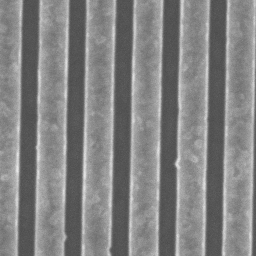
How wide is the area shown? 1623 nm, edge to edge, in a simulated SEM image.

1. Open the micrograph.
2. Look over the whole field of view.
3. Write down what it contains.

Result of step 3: parallel lines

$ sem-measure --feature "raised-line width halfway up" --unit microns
0.182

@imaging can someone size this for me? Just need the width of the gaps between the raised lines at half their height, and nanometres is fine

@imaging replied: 113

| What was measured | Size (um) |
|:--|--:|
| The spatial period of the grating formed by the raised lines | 0.297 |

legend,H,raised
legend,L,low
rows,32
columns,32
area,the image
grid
HHHLLHHHLLLHHHLLLHHHLLLHHHLLHHHH
HHHLLHHHLLLHHHLLLHHHLLLHHHLLHHHH
HHHLLHHHLLLHHHLLLHHHLLLHHHLLHHHH
HHHLLHHHLLLHHHLLLHHHLLLHHHLLHHHH
HHHLLHHHLLLHHHLLLHHHLLLHHHLLHHHH
HHHLLHHHLLLHHHLLLHHHLLLHHHLLHHHH
HHHLLHHHLLLHHHLLLHHHLLHHHHLLHHHH
HHHLLHHHLLLHHHLLLHHHLLHHHHLLHHHH
HHHLLHHHLLLHHHLLLHHHLLHHHHLLHHHH
HHLLLHHHLLLHHHLLLHHHLLHHHHLLHHHH
HHLLLHHHLLLHHHLLLHHHLLHHHHLLHHHH
HHLLLHHHLLLHHHLLLHHHLLHHHHLLHHHH
HHHLLHHHLLLHHHLLLHHHLLHHHHLLHHHH
HHLLLHHHLLLHHHLLLHHHLLHHHHLLHHHH
HHLLLHHHLLLHHHLLLHHHLLHHHHLLHHHH
HHLLLHHHLLLHHHLLHHHHLLHHHHLLHHHH
HHLLLHHHLLLHHHLLHHHHLLHHHHLLHHHH
HHLLLHHHLLLHHHLLHHHHLLHHHHLLHHHH
HHLLLHHHLLLHHHLLHHHHLLHHHHLLHHHH
HHLLLHHHLLLHHHLLHHHHLLHHHHLLHHHH
HHLLLHHHLLLHHHLLHHHHLLHHHHLLHHHH
HHLLLHHHLLLHHHLLHHHHLLHHHHLLHHHH
HHLLLHHHLLLHHHLLHHHHLLHHHHLLHHHH
HHLLLHHHLLHHHHLLHHHHLLHHHHLLHHHL
HHLLLHHHLLHHHHLLHHHHLLHHHHLLHHHL
HHLLLHHHLLHHHHLLHHHHLLHHHHLLHHHL
HHLLLHHHLLHHHHLLHHHHLLHHHHLLHHHL
HHLLLHHHLLHHHHLLHHHHLLHHHHLLHHHL
HHLLHHHHLLHHHHLLHHHHLLHHHHLLHHHL
HHLLHHHHLLHHHHLLHHHHLLHHHHLLHHHL
HHLLHHHHLLHHHHLLHHHHLLHHHHLLHHHL
HHLLHHHHLLHHHHLLHHHHLLHHHHLLHHHL